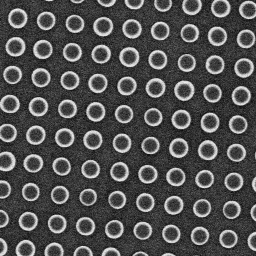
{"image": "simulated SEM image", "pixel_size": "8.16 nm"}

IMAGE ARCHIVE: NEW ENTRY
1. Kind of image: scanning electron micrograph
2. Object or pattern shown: an array of small figures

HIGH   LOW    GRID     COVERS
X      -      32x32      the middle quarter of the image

---------------XX-----XXX----XXX
-----------------------------XXX
XXX-----------------------------
XXXX---XXX-----XX---------------
XXXX--XXXXX---XXXX---XXXX----XX-
XXX---XXXXX--XXXXX---XXXX---XXXX
-------XXX----XXXX---XXXX---XXXX
--------------XXX----XXXX---XXXX
----------------------------XXXX
XX------------------------------
XXX---XXXX----XX----------------
XXX---XXXX---XXXX----XX---------
XXX---XXXX---XXXX---XXXX---XXXX-
------XXXX---XXXX---XXXX---XXXXX
--------------XX-----XXX---XXXXX
----------------------------XXX-
X-------------------------------
XX---XXXX-----X-----------------
XX---XXXX----XXX-----XX---------
XX---XXXX---XXXXX---XXXX---XXX--
X----XXXX---XXXXX---XXXX--XXXXX-
-------------XXX----XXX---XXXXX-
---------------------------XXX--
--------------------------------
X----XXX------------------------
X----XXXX---XXXX----XX----------
XX--XXXXX---XXXX---XXXX---XXX---
X----XXXX---XXXX---XXXX---XXXX--
------------XXXX---XXXX---XXXX--
--------------------XX----XXXX--
--------------------------------
X----XX-------------------------